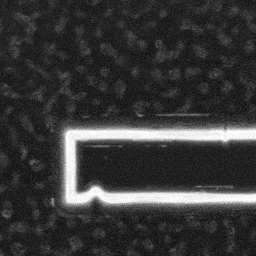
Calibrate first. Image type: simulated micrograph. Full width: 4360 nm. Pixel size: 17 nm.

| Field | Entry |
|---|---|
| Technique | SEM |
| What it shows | one or a few lines or trenches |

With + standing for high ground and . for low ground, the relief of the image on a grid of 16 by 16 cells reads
................
................
................
................
................
................
................
................
.....+++++++++++
....++++++++++++
....++++++++++++
....++++++++++++
................
................
................
................